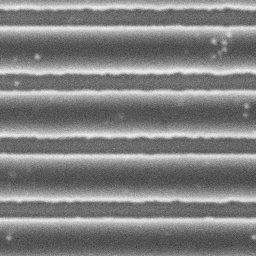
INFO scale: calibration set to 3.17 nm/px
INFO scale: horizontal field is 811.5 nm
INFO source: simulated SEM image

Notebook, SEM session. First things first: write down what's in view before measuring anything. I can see lines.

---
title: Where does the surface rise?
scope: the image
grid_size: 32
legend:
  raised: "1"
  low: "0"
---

11111111111111111111111111111111
00000000000000000000000000000000
00000000000000000000000000000000
11111111111111111111111111111111
11111111111111111111111111111111
11111111111111111111111111111111
11111111111111111111111111111111
11111111111111111111111111111111
11111111111111111111111111111111
00000000000000000000000000000000
00000000000000000000000000000000
00001110011101111101110111111111
11111111111111111111111111111111
11111111111111111111111111111111
11111111111111111111111111111111
11111111111111111111111111111111
11111111111111111111111111111111
00000000000000000000000000000000
00000000000000000000000000000000
11111111111111111111111111111111
11111111111111111111111111111111
11111111111111111111111111111111
11111111111111111111111111111111
11111111111111111111111111111111
11111111111111111111111111111111
00000000000000000000000000000000
00000000000000000000000000000000
11111111111111111111111111111111
11111111111111111111111111111111
11111111111111111111111111111111
11111111111111111111111111111111
11111111111111111111111111111111